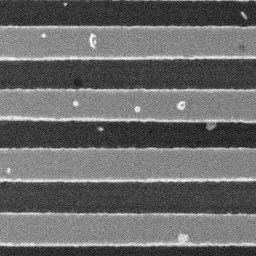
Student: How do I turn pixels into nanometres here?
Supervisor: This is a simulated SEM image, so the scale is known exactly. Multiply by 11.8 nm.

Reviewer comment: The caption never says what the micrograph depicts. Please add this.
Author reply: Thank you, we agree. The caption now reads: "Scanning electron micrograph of lines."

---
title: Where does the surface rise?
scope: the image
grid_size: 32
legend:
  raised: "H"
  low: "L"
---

LLLLLLLLLLLLLLLLLLLLLLLLLLLLLLLL
LLLLLLLLLLLLLLLLLLLLLLLLLLLLLLLL
LLLLLLLLLLLLLLLLLLLLLLLLLLLLLLLL
HHHHHHHHHHHHHHHHHHHHHHHHHHHHHHHH
HHHHHHHHHHHHHHHHHHHHHHHHHHHHHHHH
HHHHHHHHHHHHHHHHHHHHHHHHHHHHHHHH
HHHHHHHHHHHHHHHHHHHHHHHHHHHHHHHH
LLLLLLLLLLLLLLLLLLLLLLLLLLLLLLLL
LLLLLLLLLLLLLLLLLLLLLLLLLLLLLLLL
LLLLLLLLLLLLLLLLLLLLLLLLLLLLLLLL
LLLLLLLLLLLLLLLLLLLLLLLLLLLLLLLL
HHHHHHHHHHHHHHHHHHHHHHHHHHHHHHHH
HHHHHHHHHHHHHHHHHHHHHHHHHHHHHHHH
HHHHHHHHHHHHHHHHHHHHHHHHHHHHHHHH
HHHHHHHHHHHHHHHHHHHHHHHHHHHHHHHH
LLLLLLLLLLLLLLLLLLLLLLLLLLLLLLLL
LLLLLLLLLLLLLLLLLLLLLLLLLLLLLLLL
LLLLLLLLLLLLLLLLLLLLLLLLLLLLLLLL
LLLLLLLLLLLLLLLLLLLLLLLLLLLLLLLL
HHHHHHHHHHHHHHHHHHHHHHHHHHHHHHHH
HHHHHHHHHHHHHHHHHHHHHHHHHHHHHHHH
HHHHHHHHHHHHHHHHHHHHHHHHHHHHHHHH
HHHHHHHHHHHHHHHHHHHHHHHHHLLLLLLL
LLLLLLLLLLLLLLLLLLLLLLLLLLLLLLLL
LLLLLLLLLLLLLLLLLLLLLLLLLLLLLLLL
LLLLLLLLLLLLLLLLLLLLLLLLLLLLLLLL
LLLLLLLLLLLLLLLLLLLLLLLLLLLLLLLL
HHHHHHHHHHHHHHHHHHHHHHHHHHHHHHHH
HHHHHHHHHHHHHHHHHHHHHHHHHHHHHHHH
HHHHHHHHHHHHHHHHHHHHHHHHHHHHHHHH
HHHHHHHHHHHHHHHHHHHHHHHHHHHHHHHH
LLLLLLLLLLLLLLLLLLLLLLLLLLLLLLLL